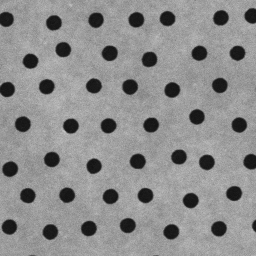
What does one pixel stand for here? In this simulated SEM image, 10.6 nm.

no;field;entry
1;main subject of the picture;a regular array of holes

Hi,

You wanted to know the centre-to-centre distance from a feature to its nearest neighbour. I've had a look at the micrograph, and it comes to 380 nm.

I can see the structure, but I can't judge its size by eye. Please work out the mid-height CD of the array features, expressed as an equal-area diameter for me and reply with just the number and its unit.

162 nanometers